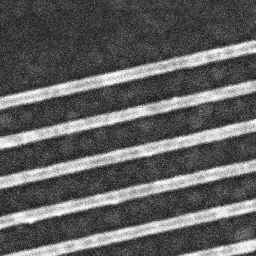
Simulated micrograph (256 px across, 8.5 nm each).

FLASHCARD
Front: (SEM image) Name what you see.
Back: parallel lines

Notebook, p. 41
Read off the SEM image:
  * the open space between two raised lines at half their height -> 250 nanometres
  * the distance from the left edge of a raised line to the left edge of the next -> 329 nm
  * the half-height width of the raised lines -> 82.9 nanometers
